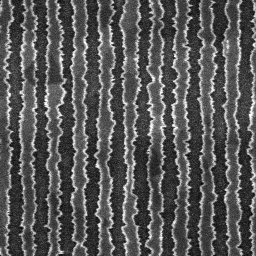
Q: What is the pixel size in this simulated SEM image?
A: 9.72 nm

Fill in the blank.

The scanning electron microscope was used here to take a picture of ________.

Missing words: parallel lines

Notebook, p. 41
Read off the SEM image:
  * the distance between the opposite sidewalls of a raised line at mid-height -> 125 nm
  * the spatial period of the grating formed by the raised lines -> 25.5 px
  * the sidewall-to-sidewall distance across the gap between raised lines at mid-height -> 125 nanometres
